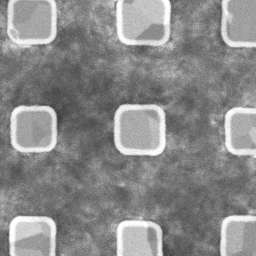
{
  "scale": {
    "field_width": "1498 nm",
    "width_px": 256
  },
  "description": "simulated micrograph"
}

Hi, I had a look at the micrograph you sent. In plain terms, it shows raised bodies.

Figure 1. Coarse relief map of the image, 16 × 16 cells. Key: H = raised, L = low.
LHHLLLLHHHLLLLHH
LHHLLLLHHHLLLLHH
LHHLLLLLHHLLLLHH
LLLLLLLLLLLLLLLL
LLLLLLLLLLLLLLLL
LLLLLLLLLLLLLLLL
LLLLLLLLLLLLLLLL
LHHLLLLHHHLLLLHH
LHHLLLLHHHLLLLHH
LLLLLLLLHHLLLLLH
LLLLLLLLLLLLLLLL
LLLLLLLLLLLLLLLL
LLLLLLLLLLLLLLLL
LLLLLLLLLLLLLLLL
LHHLLLLHHHLLLLHH
LHHLLLLHHHLLLLHH